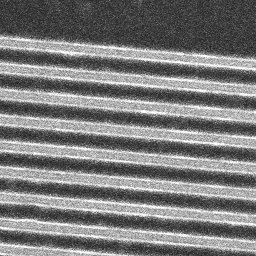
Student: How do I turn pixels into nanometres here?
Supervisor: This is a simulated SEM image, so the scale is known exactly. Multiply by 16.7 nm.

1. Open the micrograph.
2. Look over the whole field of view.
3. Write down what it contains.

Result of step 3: parallel lines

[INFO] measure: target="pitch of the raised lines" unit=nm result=431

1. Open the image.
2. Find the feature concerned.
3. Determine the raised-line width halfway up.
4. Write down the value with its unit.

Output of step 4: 293 nanometres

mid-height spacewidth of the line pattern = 137 nm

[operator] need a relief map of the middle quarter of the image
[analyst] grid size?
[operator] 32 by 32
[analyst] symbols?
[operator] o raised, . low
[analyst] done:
oooooooooooooooooooooooooooooooo
.ooooooooooooooooooooooooooooooo
.............ooooooooooooooooooo
........................oooooooo
oooooooooo......................
ooooooooooooooooooooo...........
oooooooooooooooooooooooooooooooo
oooooooooooooooooooooooooooooooo
.......ooooooooooooooooooooooooo
..................oooooooooooooo
ooooo.........................oo
oooooooooooooooo................
ooooooooooooooooooooooooooo.....
oooooooooooooooooooooooooooooooo
..oooooooooooooooooooooooooooooo
.............oooooooooooooooo.oo
........................oooooooo
ooooooooooo.....................
oooooooooooooooooooooo..........
oooooooooooooooooooooooooooooooo
oooooooooooooooooooooooooooooooo
........oooooooooooooooooooooooo
...................ooooooooooooo
ooooo.........................oo
oooooooooooooooo................
oooooooooooooooooooooooooooo....
oooooooooooooooooooooooooooooooo
...ooooooooooooooooooooooooooooo
..............oooooooooooooooooo
.........................ooooooo
ooooooooooo.....................
oooooooooooooooooooooo..........